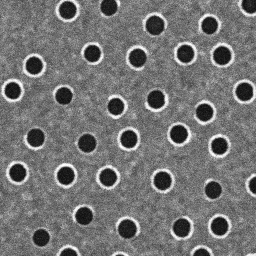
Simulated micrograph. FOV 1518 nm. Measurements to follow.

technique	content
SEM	a regular array of holes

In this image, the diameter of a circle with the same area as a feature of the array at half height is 107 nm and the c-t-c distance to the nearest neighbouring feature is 225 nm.